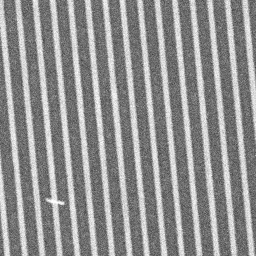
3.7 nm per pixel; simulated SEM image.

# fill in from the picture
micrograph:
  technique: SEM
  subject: parallel lines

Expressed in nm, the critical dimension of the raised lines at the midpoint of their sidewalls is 14.2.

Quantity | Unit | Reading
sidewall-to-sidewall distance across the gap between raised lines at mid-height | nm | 50.1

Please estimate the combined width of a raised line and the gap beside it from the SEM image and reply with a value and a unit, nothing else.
64.2 nanometers